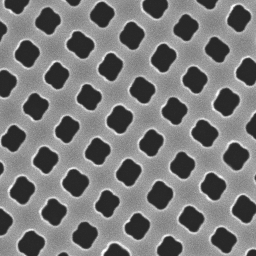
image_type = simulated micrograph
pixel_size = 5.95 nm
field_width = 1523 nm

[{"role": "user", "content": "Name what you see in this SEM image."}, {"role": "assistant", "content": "a regular array of holes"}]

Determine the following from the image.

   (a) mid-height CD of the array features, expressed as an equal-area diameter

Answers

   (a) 146 nm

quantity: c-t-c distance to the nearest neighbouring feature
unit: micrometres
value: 0.222